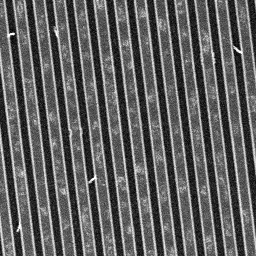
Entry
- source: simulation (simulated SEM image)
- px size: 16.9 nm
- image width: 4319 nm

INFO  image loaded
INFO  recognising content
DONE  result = parallel lines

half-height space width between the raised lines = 144 nanometres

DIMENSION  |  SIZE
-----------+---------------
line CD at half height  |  193 nm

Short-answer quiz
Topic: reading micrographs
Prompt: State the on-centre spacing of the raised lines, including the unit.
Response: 20 px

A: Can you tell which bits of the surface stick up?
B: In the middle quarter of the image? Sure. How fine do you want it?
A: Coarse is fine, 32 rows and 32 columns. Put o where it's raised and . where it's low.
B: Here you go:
oo..ooo..ooo...oo...oo...oo...oo
oo...oo...oo...ooo..ooo..ooo..oo
oo...oo...oo...ooo..ooo..ooo..oo
ooo..ooo..ooo..ooo..ooo..ooo..oo
ooo..ooo..ooo..ooo..ooo..ooo..oo
ooo..ooo..ooo..ooo..ooo..ooo..oo
ooo..ooo..ooo..ooo..ooo..ooo..oo
ooo..ooo..ooo..ooo...oo...oo...o
ooo..ooo..ooo..ooo...oo...oo...o
.oo...oo...oo...ooo..ooo..ooo..o
.oo...oo...oo...ooo..ooo..ooo..o
.oo...oo...ooo..ooo..ooo..ooo..o
.ooo..ooo..ooo..ooo..ooo..ooo..o
.ooo..ooo..ooo..ooo..ooo..ooo..o
.ooo..ooo..ooo..ooo..ooo..ooo..o
.ooo..ooo..ooo...oo...oo...oo...
.ooo..ooo..ooo...oo...oo...oo...
..oo...oo...oo...oo...oo...ooo..
..oo...oo...oo...ooo..ooo..ooo..
..oo...oo...oo...ooo..ooo..ooo..
..ooo..ooo..ooo..ooo..ooo..ooo..
..ooo..ooo..ooo..ooo..ooo..ooo..
..ooo..ooo..ooo..ooo..ooo..ooo..
..ooo..ooo..ooo..ooo...oo...oo..
..ooo..ooo..ooo..ooo...oo...oo..
..ooo..ooo..ooo...oo...oo...oo..
...oo...oo...oo...ooo..ooo..ooo.
...oo...oo...oo...ooo..ooo..ooo.
o..ooo.oooo..ooo..ooo..ooo..ooo.
o..ooo..ooo..ooo..ooo..ooo..ooo.
o..ooo..ooo..ooo..ooo..ooo..ooo.
o..ooo..ooo..ooo..ooo..ooo..ooo.